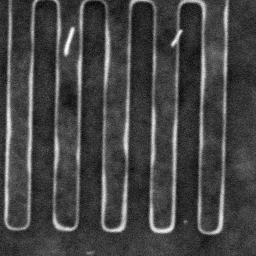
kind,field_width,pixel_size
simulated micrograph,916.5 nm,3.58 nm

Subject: groups of lines, slits or small figures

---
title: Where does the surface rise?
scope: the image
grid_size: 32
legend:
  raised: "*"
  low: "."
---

.***...****..***...****..***....
.***...***...***...***...***....
.***...***...***...***...***....
.***...***...***...***...***....
.***...***...***...***...***....
.***...***...***...***...***....
.***...***...***...***...***....
.***...***...***...***...***....
.***...***...***...***...***....
.***...***...***...***...***....
.***...***...***...***...***....
.***...***...***...***...***....
.***...***...***...***...***....
.***...***...***...***...***....
.***...***...***...***...***....
.***...***...***...***...***....
.***...***...***...***...***....
.***...***...***...***...***....
.***...***...***...***...***....
.***...***...***...***...***....
.***...***...***...***...***....
.***...***...***...***...***....
.***...***...***...***...***....
.***...***...***...***...***....
.***...***...***...***...***....
.***...***...***...***...***....
.***...***...**....***...***....
.***...***...**....***...***....
.**.....*....**....**....**.....
................................
................................
................................